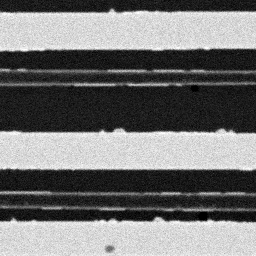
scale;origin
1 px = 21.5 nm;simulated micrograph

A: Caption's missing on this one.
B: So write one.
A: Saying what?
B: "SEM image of lines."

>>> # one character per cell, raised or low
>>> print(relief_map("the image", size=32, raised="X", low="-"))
--------------------------------
--------------------------------
XXXXXXXXXXXXXXXXXXXXXXXXXXXXXXXX
XXXXXXXXXXXXXXXXXXXXXXXXXXXXXXXX
XXXXXXXXXXXXXXXXXXXXXXXXXXXXXXXX
XXXXXXXXXXXXXXXXXXXXXXXXXXXXXXXX
--------------------------------
--------------------------------
--------------------------------
XXXXXXXXXXXXXXXXXXXXXXXXXXXXXXXX
XXXXXXXXXXXXXXXXXXXXXXXX--X-----
--------------------------------
--------------------------------
--------------------------------
--------------------------------
--------------------------------
--------------X------------X----
XXXXXXXXXXXXXXXXXXXXXXXXXXXXXXXX
XXXXXXXXXXXXXXXXXXXXXXXXXXXXXXXX
XXXXXXXXXXXXXXXXXXXXXXXXXXXXXXXX
XXXXXXXXXXXXXXXXXXXXXXXXXXXXXXXX
--------------------------------
--------------------------------
--------------------------------
XXXXXXXXXXXXXXXXXXXXXXXXXXXXXXXX
XXXXXXXXXXXXXXXXXXXXXXXXXXXXXXXX
--------------------------------
-------------------X------------
XXXXXXXXXXXXXXXXXXXXXXXXXXXXXXXX
XXXXXXXXXXXXXXXXXXXXXXXXXXXXXXXX
XXXXXXXXXXXXXXXXXXXXXXXXXXXXXXXX
XXXXXXXXXXXXXXXXXXXXXXXXXXXXXXXX